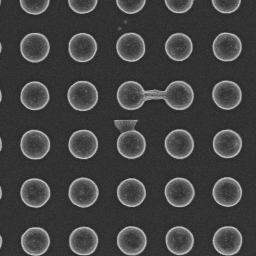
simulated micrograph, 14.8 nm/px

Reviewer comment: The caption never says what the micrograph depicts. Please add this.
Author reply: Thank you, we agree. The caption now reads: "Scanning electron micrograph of a regular array of raised bodies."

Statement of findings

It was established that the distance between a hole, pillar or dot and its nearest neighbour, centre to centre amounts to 711 nm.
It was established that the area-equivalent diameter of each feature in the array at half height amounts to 417 nanometres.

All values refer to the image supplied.